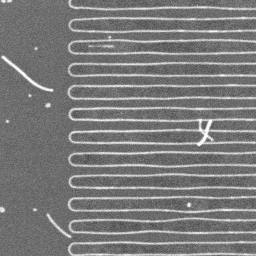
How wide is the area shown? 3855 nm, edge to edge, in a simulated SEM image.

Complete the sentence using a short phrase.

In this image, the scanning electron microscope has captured groups of lines, slits or small figures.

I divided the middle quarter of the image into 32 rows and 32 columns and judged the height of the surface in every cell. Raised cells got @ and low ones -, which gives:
--@@@@@@@@@@@@@@@@@@@@@@@@@@@@@@
-@@@@@@@@@@@@@@@@@@@@@@@@@@@@@@@
--@@@@@@@@@@@@@@@@@@@@@@@@@@@@@@
--------------------------------
--------------------------------
----------------------@@@@------
-@@@@@@@@@@@@@@@@@@@@@@@@@@@@@@@
-@@@@@@@@@@@@@@@@@@@@@@@@@@@@@@@
--@@@@@@@@@@@@@@@@@@@@@@@@@@----
--------------------------------
--------------------------------
--@@@@@@@@@@@@@@@@@@@@@@@@@@@@@@
-@@@@@@@@@@@@@@@@@@@@@@@@@@@@@@@
--@@@@@@@@@@@@@@@@@@@@@@@@@@@@@@
--------------------------------
--------------------------------
--------------------------------
--@@@@@@@@@@@@@@@@@@@@@@@@@@@@@@
-@@@@@@@@@@@@@@@@@@@@@@@@@@@@@@@
--@@@@@@@@@@@@@@@@@@@@@@@@@@@@@@
--------------------------------
--------------------------------
--@@@@@@@@@@@@@@@@@@@@@@@@@@@@@@
-@@@@@@@@@@@@@@@@@@@@@@@@@@@@@@@
-@@@@@@@@@@@@@@@@@@@@@@@@@@@@@@@
-------@@-------------@@@@@@@@@-
--------------------------------
--------------------------------
--@@@@@@@@@@@@@@@@@@@@@@@@@@@@@@
-@@@@@@@@@@@@@@@@@@@@@@@@@@@@@@@
--@@@@@@@@@@@@@@@@@@@@@@@@@@@@@@
--------------------------------